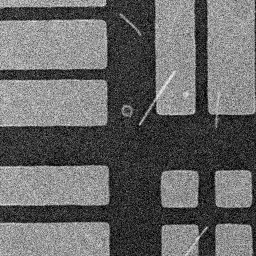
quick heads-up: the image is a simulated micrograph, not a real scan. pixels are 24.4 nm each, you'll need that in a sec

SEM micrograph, groups of lines, slits or small figures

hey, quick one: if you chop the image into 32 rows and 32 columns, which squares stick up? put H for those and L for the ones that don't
HHHHHHHHHHHHHLLLLLLLHHHHLLHHHHHH
LLLLLLLLLLLLLLLLLLLLHHHHLLHHHHHH
LLLLLLLLLLLLLLLLLLLLHHHHLLHHHHHH
HHHHHHHHHHHHHLLLLLLLHHHHLLHHHHHH
HHHHHHHHHHHHHLLLLLLLHHHHLLHHHHHH
HHHHHHHHHHHHHLLLLLLLHHHHLLHHHHHH
HHHHHHHHHHHHHLLLLLLLHHHHLLHHHHHH
HHHHHHHHHHHHHLLLLLLLHHHHLLHHHHHH
HHHHHHHHHHHHHLLLLLLLHHHHLLHHHHHH
LLLLLLLLLLLLLLLLLLLLHHHHLLHHHHHH
HHHHHHHHHHHHHLLLLLLLHHHHLLHHHHHH
HHHHHHHHHHHHHLLLLLLLHHHHLLHHHHHH
HHHHHHHHHHHHHLLLLLLHHHHHLLHHHHHH
HHHHHHHHHHHHHLLHLLLLHHHHLLHHHHHH
HHHHHHHHHHHHHLLLLLLLLLLLLLLLLLLL
HHHHHHHHHHHHHLLLLLLLLLLLLLLLLLLL
LLLLLLLLLLLLLLLLLLLLLLLLLLLLLLLL
LLLLLLLLLLLLLLLLLLLLLLLLLLLLLLLL
LLLLLLLLLLLLLLLLLLLLLLLLLLLLLLLL
LLLLLLLLLLLLLLLLLLLLLLLLLLLLLLLL
LLLLLLLLLLLLLLLLLLLLLLLLLLLLLLLL
HHHHHHHHHHHHHHLLLLLLLHHHLLLHHHHL
HHHHHHHHHHHHHHLLLLLLHHHHHLLHHHHL
HHHHHHHHHHHHHHLLLLLLHHHHHLLHHHHL
HHHHHHHHHHHHHHLLLLLLHHHHHLLHHHHL
HHHHHHHHHHHHHLLLLLLLHHHHHLLHHHHL
LLLLLLLLLLLLLLLLLLLLLLLLLLLLLLLL
LLLLLLLLLLLLLLLLLLLLLLLLLLLLLLLL
HHHHHHHHHHHHHHLLLLLLHHHHHLLHHHHL
HHHHHHHHHHHHHHLLLLLLHHHHHLLHHHHL
HHHHHHHHHHHHHHLLLLLLHHHHHLLHHHHL
HHHHHHHHHHHHHHLLLLLLHHHHHLLHHHHL